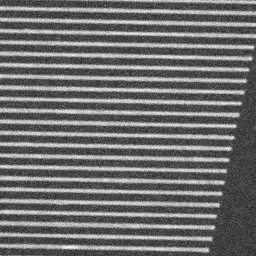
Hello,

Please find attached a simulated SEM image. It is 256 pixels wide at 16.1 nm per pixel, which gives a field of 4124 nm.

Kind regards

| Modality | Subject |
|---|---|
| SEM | parallel lines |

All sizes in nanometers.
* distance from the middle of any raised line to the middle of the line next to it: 182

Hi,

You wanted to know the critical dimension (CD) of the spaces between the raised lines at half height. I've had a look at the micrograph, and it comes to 0.133 um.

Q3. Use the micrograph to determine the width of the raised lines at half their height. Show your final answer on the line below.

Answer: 0.0443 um